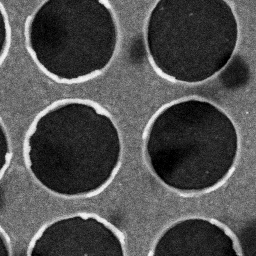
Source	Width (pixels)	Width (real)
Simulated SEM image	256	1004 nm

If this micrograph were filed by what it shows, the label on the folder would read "holes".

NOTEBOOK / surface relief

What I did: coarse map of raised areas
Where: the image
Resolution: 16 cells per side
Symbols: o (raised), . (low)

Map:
ooo....ooo....oo
oo.....oo......o
oo.....oo......o
oo.....ooo....oo
ooo...oooo....oo
oooooooooooooooo
ooooooooooo..ooo
ooo....ooo....oo
oo.....oo......o
oo......o......o
oo.....oo.....oo
ooo...oooo...ooo
oooooooooooooooo
oooooooooooooooo
ooo....ooo....oo
oo......oo.....o